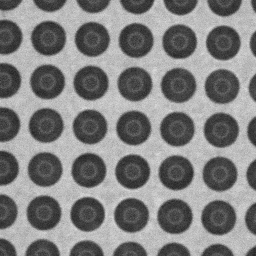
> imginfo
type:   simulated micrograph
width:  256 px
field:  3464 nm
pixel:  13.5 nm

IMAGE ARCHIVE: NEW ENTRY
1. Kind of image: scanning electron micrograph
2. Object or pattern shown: an array of small figures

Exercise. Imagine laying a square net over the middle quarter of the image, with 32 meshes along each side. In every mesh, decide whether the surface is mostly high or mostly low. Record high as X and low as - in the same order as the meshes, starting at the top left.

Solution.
XXXXXX--XXXXXXXXXXXXXXXXXXXXXXXX
XXXX------XXXXX-----XXXXXX-----X
XXX--------XXX-------XXXX-------
XX---------XXX--------XXX-------
XX---------XX---------XX--------
XX---------XX---------XX--------
XXX--------XXX--------XX--------
XXX-------XXXX-------XXXX-------
XXXX-----XXXXXX------XXXX-------
XXXXXXXXXXXXXXXXX-XXXXXXXXX---XX
XXXXXXXXXXXXXXXXXXXXXXXXXXXXXXXX
XXXXX---XXXXXXXXX-XXXXXXXXXXXXXX
XXX-------XXXXX-----XXXXXX-----X
XXX-------XXXX-------XXXX-------
XX---------XX---------XX--------
XX---------XX---------XX--------
XX---------XX---------XX--------
XX---------XX---------XX--------
XXX-------XXXX-------XXXX-------
XXXX-----XXXXXX-----XXXXX------X
XXXXXXXXXXXXXXXXX-XXXXXXXXX---XX
XXXXXXXXXXXXXXXXXXXXXXXXXXXXXXXX
XXXX----XXXXXXXX--XXXXXXXXXXXXXX
XXX------XXXXX------XXXXXX-----X
XX--------XXX--------XXX--------
XX---------XX--------XXX--------
XX---------X----------XX--------
XX---------XX---------XX--------
XX--------XXX--------XXX--------
XXX-------XXX--------XXX--------
XXXX-----XXXXX------XXXXX------X
XXXXXXXXXXXXXXXX--XXXXXXXXX--XXX